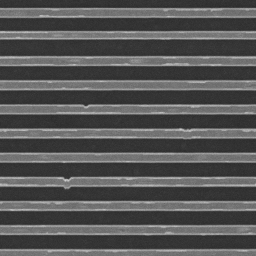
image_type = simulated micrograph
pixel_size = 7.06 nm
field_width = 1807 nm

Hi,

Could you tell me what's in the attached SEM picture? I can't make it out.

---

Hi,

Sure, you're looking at parallel lines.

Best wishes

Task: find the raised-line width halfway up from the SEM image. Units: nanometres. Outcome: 60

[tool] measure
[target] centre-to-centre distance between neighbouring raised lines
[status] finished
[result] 170 nm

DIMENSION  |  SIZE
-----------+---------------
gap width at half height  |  106 nm